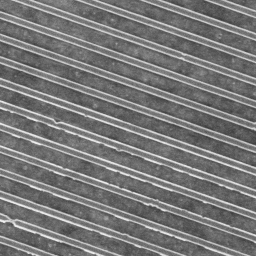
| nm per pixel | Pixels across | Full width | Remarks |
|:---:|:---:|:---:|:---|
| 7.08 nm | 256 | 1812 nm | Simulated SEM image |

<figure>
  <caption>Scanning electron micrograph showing parallel lines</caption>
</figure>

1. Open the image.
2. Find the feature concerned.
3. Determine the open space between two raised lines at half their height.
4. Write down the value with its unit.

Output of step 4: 105 nm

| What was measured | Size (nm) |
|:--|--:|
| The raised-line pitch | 150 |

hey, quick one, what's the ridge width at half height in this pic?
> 46 nanometers